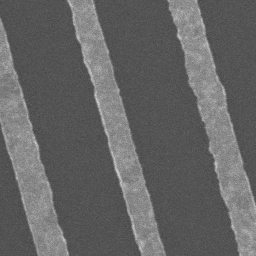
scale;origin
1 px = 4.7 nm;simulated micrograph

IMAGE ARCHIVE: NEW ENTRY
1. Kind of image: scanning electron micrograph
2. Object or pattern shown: one or a few lines or trenches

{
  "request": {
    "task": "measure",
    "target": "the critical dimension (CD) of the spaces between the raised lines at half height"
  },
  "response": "0.338 micrometres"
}